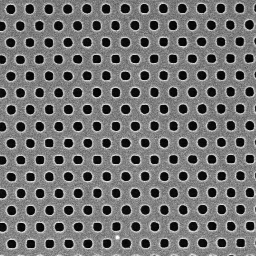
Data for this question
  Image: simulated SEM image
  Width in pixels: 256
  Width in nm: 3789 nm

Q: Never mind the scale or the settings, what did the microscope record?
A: a regular array of holes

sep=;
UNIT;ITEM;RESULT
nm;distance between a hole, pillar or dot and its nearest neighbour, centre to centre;279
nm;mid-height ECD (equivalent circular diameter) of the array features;138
